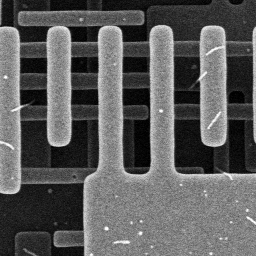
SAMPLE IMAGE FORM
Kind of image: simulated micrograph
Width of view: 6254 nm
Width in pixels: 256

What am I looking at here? wiring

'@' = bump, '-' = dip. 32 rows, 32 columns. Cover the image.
--------------------------------
---@@@@@@@@@@@@@@@--------------
--@@@@@@@@@@@@@@@@--------------
@@----@@@---@@@----@@-----@@----
@@----@@@---@@@----@@@---@@@----
@@@@@@@@@@@@@@@@@@@@@@@@@@@@@@@@
@@@@@@@@@@@@@@@@@@@@@@@@@@@@@@@@
@@@---@@@---@@@----@@@---@@@----
@@----@@@---@@@----@@@---@@@----
@@@@@@@@@@@@@@@@@@@@@@---@@@----
@@@@@@@@@@@@@@@@@@@@@@---@@@----
@@@---@@@---@@@----@@@---@@@----
@@----@@@---@@@----@@@---@@@----
@@@@@@@@@@@@@@@@@@@@@@@@@@@@@@@@
@@@@@@@@@@@@@@@@@@@@@@@@@@@@@@@@
@@@---@@@---@@@----@@@---@@@----
@@@---@@@---@@@----@@@---@@@----
@@@---@@@---@@@----@@@---@@@----
@@@---------@@@----@@@----------
@@@---------@@@----@@@----------
@@@---------@@@----@@@----------
@@@@@@@@@@@@@@@@@@@@@@@@@@------
@@@@@@@@@@@@@@@@@@@@@@@@@@@@@@@@
@@---------@@@@@@@@@@@@@@@@@@@@@
----------@@@@@@@@@@@@@@@@@@@@@@
----------@@@@@@@@@@@@@@@@@@@@@@
----------@@@@@@@@@@@@@@@@@@@@@@
----------@@@@@@@@@@@@@@@@@@@@@@
----------@@@@@@@@@@@@@@@@@@@@@@
-------@@@@@@@@@@@@@@@@@@@@@@@@@
-------@@@@@@@@@@@@@@@@@@@@@@@@@
-----------@@@@@@@@@@@@@@@@@@@@@